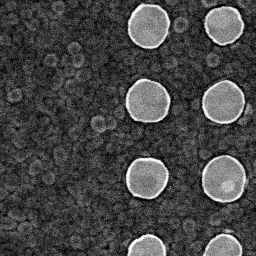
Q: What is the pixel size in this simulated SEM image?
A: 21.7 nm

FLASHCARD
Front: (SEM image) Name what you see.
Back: raised bodies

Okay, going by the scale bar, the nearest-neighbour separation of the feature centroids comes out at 1640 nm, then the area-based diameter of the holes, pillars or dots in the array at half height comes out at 901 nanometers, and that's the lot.